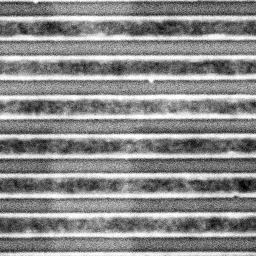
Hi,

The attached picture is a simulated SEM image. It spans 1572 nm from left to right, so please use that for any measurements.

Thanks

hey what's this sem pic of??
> parallel lines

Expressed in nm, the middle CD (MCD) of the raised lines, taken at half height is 131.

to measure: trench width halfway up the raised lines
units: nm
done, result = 114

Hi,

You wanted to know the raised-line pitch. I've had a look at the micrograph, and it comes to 242 nm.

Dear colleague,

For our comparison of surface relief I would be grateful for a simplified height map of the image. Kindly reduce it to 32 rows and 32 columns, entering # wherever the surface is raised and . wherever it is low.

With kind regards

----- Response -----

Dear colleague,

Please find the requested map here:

................................
................................
################################
################################
################################
................................
................................
################################
################################
################################
................................
................................
################################
################################
################################
................................
................................
################################
################################
################################
................................
................................
################################
################################
####............................
................................
................................
################################
################################
................................
................................
................................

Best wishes